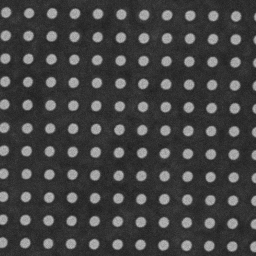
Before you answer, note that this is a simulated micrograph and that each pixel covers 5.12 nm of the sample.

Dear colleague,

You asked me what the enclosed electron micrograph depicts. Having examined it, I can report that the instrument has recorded a regular array of raised bodies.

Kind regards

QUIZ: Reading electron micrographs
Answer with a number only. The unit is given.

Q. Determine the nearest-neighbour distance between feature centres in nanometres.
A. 116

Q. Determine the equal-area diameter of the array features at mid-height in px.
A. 10.2